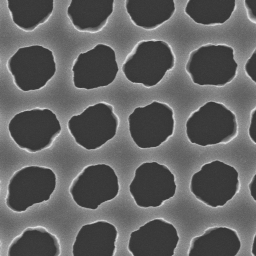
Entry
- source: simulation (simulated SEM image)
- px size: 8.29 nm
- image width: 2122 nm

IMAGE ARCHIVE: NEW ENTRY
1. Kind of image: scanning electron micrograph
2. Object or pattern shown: a regular array of holes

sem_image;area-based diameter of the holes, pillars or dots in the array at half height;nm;375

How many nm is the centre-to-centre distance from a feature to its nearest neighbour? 481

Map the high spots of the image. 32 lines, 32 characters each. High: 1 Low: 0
10000001100000110000001000000110
10000011000000110000001000000110
11000011100001111000011100001111
11101111110011111101111111111111
11111111111111111111111111111111
11111111111111111100011111111111
11000011111000111000011100000111
10000001110000010000001100000110
10000001100000000000011000000010
11000001100000110000111100000110
11000011100000111101111110001111
11111111111111111111111111111111
11111111111111111111111111111111
11111111111000111000011110001111
11000001100000110000001100000111
10000001100000010000001000000110
10000001100000110000001000000110
11000011100000111000011100001111
11100111111011111111111111111111
11111111111111111111111111111111
11111111111111111100111111001111
11000001110000111000011110000011
10000001110000011000001100000011
10000001100000010000001100000010
10000011100000111000001100000110
10001111110001111000111111001111
11111111111111111111111111111111
11111111111111111110111111111111
11111111110000111100001111101111
11100001110000010000001110000011
11000001100000110000001100000011
10000001100000110000001100000011